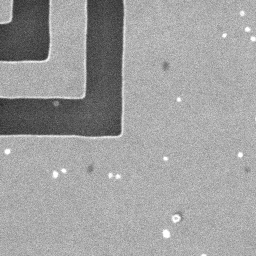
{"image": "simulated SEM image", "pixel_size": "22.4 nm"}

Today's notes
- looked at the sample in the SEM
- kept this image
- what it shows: groups of lines, slits or small figures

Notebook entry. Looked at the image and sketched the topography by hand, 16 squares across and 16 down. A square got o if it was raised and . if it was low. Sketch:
o..oo...oooooooo
...oo...oooooooo
...oo...oooooooo
...oo...oooooooo
ooooo...oooooooo
ooooo...oooooooo
........oooooooo
........oooooooo
oo.....ooooooooo
oooooooooooooooo
oooooooooooooooo
oooooooooooooooo
oooooooooooooooo
oooooooooooooooo
oooooooooooooooo
oooooooooooooooo